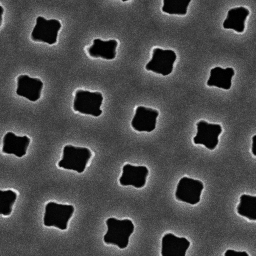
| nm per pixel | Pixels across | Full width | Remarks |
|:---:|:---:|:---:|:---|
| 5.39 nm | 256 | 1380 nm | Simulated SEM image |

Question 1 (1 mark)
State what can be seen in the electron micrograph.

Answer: a regular array of holes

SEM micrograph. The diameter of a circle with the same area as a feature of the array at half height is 139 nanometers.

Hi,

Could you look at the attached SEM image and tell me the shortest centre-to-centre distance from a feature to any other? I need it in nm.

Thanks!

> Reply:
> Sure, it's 314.